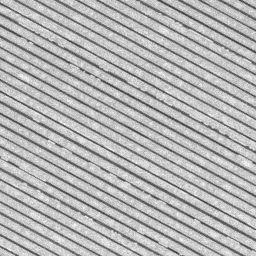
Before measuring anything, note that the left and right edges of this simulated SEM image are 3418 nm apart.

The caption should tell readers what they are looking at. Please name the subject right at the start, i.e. parallel lines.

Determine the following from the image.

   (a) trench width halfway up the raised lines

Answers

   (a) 26.4 nm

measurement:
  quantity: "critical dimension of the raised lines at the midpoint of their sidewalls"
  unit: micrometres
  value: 0.104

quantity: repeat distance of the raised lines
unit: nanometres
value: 130